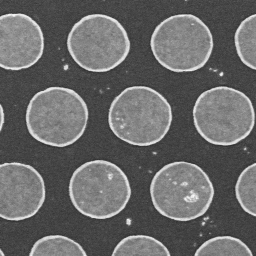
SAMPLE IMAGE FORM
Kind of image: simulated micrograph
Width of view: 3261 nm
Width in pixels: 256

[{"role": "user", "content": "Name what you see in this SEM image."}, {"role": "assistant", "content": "raised bodies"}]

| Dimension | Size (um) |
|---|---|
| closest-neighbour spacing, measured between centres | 1.06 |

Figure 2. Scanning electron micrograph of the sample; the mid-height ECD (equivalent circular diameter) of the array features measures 742 nm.